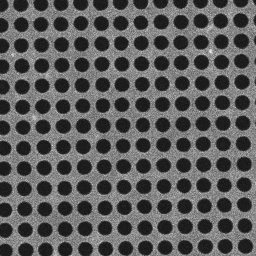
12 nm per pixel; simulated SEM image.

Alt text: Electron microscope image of a regular array of holes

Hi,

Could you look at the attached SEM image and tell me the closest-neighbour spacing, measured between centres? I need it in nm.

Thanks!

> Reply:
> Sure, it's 237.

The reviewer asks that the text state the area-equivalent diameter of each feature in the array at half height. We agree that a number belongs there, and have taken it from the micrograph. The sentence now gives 184 nm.